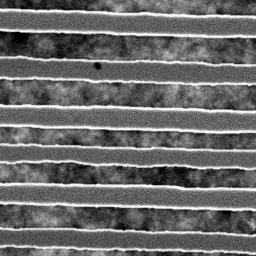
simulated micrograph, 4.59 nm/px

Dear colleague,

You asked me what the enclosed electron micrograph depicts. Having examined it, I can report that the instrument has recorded lines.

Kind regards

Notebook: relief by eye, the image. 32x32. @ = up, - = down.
--------------------------------
@@@@@@@@@@@@@-------------------
@@@@@@@@@@@@@@@@@@@@@@@@@@@@@@@@
@@@@@@@@@@@@@@@@@@@@@@@@@@@@@@@@
----------------------@@@@@@@@@@
--------------------------------
--------------------------------
@@@@@@@@@@@---------------------
@@@@@@@@@@@@@@@@@@@@@@@@@@@@@@@@
@@@@@@@@@@@@@@@@@@@@@@@@@@@@@@@@
----------------------@@@@@@@@@@
--------------------------------
--------------------------------
@@@@@@@@@@@@@@@@@@--------------
@@@@@@@@@@@@@@@@@@@@@@@@@@@@@@@@
@@@@@@@@@@@@@@@@@@@@@@@@@@@@@@@@
---------------------------@----
--------------------------------
@@@@@@@@@@@@@@@@@--@@-----------
@@@@@@@@@@@@@@@@@@@@@@@@@@@@@@@@
----------@@@@@@@@@@@@@@@@@@@@@@
--------------------------------
--------------------------------
@@@@@@@@@@@@@@@@@@@@@@@---------
@@@@@@@@@@@@@@@@@@@@@@@@@@@@@@@@
---@@@@@@@@@@@@@@@@@@@@@@@@@@@@@
--------------------------------
--------------------------------
@-------------------------------
@@@@@@@@@@@@@@@@@@@@@@@@@@@@@@@@
@@@@@@@@@@@@@@@@@@@@@@@@@@@@@@@@
-------------------------@@-@@@@